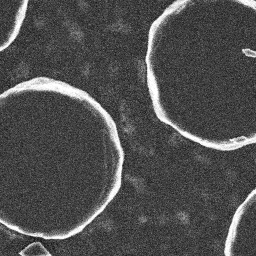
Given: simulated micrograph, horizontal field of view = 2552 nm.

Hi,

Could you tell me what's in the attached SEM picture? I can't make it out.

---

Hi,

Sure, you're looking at raised bodies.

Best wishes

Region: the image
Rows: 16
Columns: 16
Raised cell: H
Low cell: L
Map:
HHLLLLLLLLLHHHHH
HLLLLLLLLLHHHHHH
HLLLLLLLLHHHHHHH
LLLLLLLLLHHHHHHH
LLLLLLLLLHHHHHHH
LHHHLLLLLHHHHHHH
HHHHHHLLLLHHHHHH
HHHHHHHLLLHHHHHH
HHHHHHHLLLLLHHHH
HHHHHHHHLLLLLLLL
HHHHHHHHLLLLLLLL
HHHHHHHLLLLLLLLL
HHHHHHHLLLLLLLLH
HHHHHHLLLLLLLLLH
LHHHHLLLLLLLLLHH
LLLLLLLLLLLLLLHH